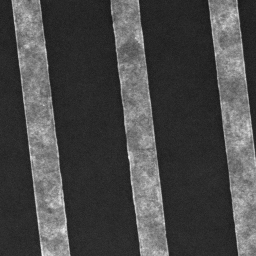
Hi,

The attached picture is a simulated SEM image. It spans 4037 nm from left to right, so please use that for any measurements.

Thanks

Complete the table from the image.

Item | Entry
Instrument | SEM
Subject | one or a few lines or trenches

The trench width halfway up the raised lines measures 1.1 micrometres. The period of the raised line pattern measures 1540 nanometers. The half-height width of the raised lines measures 27.6 px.